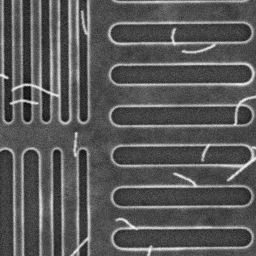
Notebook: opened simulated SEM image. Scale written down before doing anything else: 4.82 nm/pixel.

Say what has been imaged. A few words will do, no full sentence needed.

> groups of lines, slits or small figures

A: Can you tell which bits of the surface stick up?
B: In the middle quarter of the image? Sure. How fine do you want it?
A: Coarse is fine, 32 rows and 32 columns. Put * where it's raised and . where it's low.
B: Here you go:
.***..*******...................
.***..******....................
..**..******....................
..**..******....................
.***..******....................
.***..**************************
.***..**************************
.***..**************************
.***..**************************
.***..**************************
.***..******************........
.***..******....................
..**..******....................
.***..******....................
.***********....................
**************..................
********************************
********************************
********************************
********************************
****************................
****.*******....................
****..******....................
****..******....................
****..*******...................
****..**************************
****..**************************
****..**************************
****..**************************
****..**************************
****..*********************..***
****..*******...................